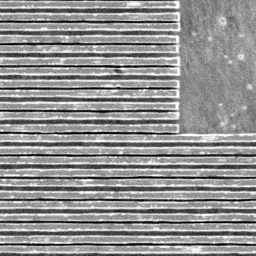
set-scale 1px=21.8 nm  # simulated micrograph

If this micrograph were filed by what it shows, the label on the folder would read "parallel lines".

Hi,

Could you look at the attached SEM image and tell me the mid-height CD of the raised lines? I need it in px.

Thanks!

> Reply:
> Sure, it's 6.75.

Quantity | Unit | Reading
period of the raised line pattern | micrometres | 0.243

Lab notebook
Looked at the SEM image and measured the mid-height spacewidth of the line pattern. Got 106 nanometers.